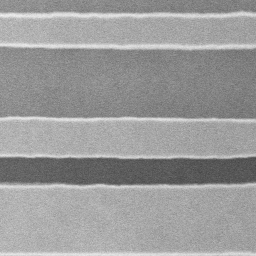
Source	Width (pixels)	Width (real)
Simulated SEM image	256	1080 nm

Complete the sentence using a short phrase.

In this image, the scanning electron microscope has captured lines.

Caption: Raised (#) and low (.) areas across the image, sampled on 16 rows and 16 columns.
................
################
################
................
................
................
................
################
################
################
................
................
################
################
################
################